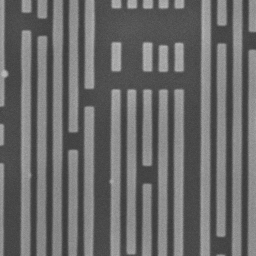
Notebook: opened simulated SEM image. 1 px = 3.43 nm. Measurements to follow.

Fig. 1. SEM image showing groups of lines, slits or small figures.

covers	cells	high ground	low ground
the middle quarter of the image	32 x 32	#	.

..#..##.....##......##..##..##..
.##..##.....##......##..##..##..
.##..##.........................
.##..##.........................
.##..##.........................
.##..##.........................
.##.............................
.##.........##..##..##..##..##..
..#.........##..##..##..##..##..
..#.........##..##..##..##..##..
..#.........##..##..##..##..##..
..#..##.....##..##..##..##..##..
.##..##.....##..##..##..##..##..
.##..##.....##..##..##..##..##..
.##..##.....##..##..##..##..##..
.##..##.....##..##..##..##..##..
.##..##.....##..##..##..##..##..
.....##.....##..##..##..##..##..
.....##.....##..##..##..##..##..
.....##.....##..##..##..##..##..
.....##.....##..##..##..##..##..
.....##.....##..##..##..##..##..
.##..##.....##..##..##..##..##..
.##..##.....##..##..##..##..##..
.##..##.....##..##..##..##..##..
.##..##.....##..##......##..##..
.##..##.....##..##......##..##..
.##..##.....##..##......##..##..
.##..##.....##..##......##..##..
.##..##.....##..##......##..##..
.##..##.....##..##..##..##..##..
.##..##.....##..##..##..##..##..